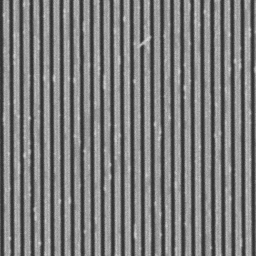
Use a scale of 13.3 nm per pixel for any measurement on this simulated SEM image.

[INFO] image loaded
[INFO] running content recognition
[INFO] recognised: parallel lines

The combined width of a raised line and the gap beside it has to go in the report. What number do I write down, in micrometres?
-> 0.134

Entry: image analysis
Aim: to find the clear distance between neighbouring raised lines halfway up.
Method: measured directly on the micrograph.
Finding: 59.9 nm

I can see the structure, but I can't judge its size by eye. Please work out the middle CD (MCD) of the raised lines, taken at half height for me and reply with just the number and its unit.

69.9 nanometers